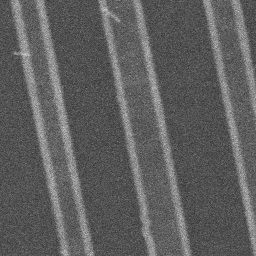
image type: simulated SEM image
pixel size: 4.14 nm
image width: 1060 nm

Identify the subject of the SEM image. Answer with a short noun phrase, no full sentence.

one or a few lines or trenches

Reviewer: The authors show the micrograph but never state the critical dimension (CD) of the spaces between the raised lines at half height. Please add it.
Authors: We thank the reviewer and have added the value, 248 nanometers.